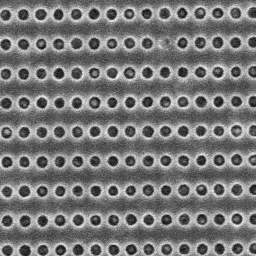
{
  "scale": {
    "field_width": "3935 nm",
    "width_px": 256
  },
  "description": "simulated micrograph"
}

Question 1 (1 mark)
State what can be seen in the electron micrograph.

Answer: a regular array of holes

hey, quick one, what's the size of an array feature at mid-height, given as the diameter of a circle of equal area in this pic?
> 183 nanometres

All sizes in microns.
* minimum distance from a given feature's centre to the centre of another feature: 0.27